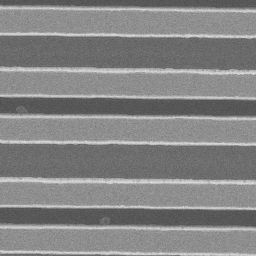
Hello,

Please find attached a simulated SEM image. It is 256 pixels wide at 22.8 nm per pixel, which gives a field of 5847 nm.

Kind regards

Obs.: lines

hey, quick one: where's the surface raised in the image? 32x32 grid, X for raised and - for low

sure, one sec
--------------------------------
XXXXXXXXXXXXXXXXXXXXXXXXXXXXXXXX
XXXXXXXXXXXXXXXXXXXXXXXXXXXXXXXX
XXXXXXXXXXXXXXXXXXXXXXXXXXXXXXXX
---------------XXXXXXXXXXXXXXXXX
--------------------------------
--------------------------------
--------------------------------
X-------------------------------
XXXXXXXXXXXXXXXXXXXXXXXXXXXXXXXX
XXXXXXXXXXXXXXXXXXXXXXXXXXXXXXXX
XXXXXXXXXXXXXXXXXXXXXXXXXXXXXXXX
--------------------------------
--------------------------------
XXXXXXXXXXXXXXXX----------------
XXXXXXXXXXXXXXXXXXXXXXXXXXXXXXXX
XXXXXXXXXXXXXXXXXXXXXXXXXXXXXXXX
XXXXXXXXXXXXXXXXXXXXXXXXXXXXXXXX
--------------------------------
--------------------------------
--------------------------------
--------------------------------
XXXXXXX--XXX--------------------
XXXXXXXXXXXXXXXXXXXXXXXXXXXXXXXX
XXXXXXXXXXXXXXXXXXXXXXXXXXXXXXXX
XXXXXXXXXXXXXXXXXXXXXXXXXXXXXXXX
--------------------------------
--------------------------------
XXXXXXXXXXXXXXXXXXXXXXXXXXXXXXXX
XXXXXXXXXXXXXXXXXXXXXXXXXXXXXXXX
XXXXXXXXXXXXXXXXXXXXXXXXXXXXXXXX
XXXXXXXXXXXXXXXXXXXXXXXXXXXXXXXX